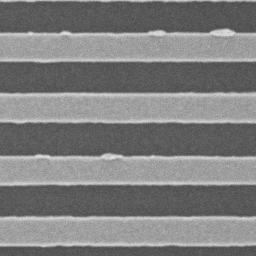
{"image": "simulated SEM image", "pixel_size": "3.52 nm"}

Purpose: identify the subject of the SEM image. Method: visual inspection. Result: lines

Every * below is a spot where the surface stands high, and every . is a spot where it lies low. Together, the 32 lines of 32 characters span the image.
................................
................................
................................
................................
********************************
********************************
********************************
********************************
................................
................................
................................
................................
********************************
********************************
********************************
................................
................................
................................
................................
....**.......**....*............
********************************
********************************
********************************
................................
................................
................................
................................
********************************
********************************
********************************
********************************
................................